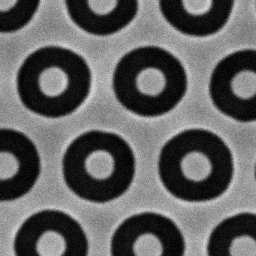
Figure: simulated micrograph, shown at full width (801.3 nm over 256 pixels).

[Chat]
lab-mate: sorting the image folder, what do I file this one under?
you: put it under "ring-shaped grooves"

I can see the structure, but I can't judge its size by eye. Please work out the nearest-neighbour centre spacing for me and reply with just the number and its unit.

95.8 pixels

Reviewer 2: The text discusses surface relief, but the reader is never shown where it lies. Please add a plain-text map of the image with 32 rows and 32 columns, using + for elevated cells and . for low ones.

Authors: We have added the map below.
++...+++...+++...+++...+++...+++
....++++....++...+++....+....+++
....+++++........++++........+++
...+++++++......++++++......++++
++++++++++++.++++++++++...++++++
++++++++++++++++++++++++++++++++
++++......++++++.....++++++++...
+++........++++........+++++....
++....+....+++.........++++.....
++...+++....++...+++...+++....++
++...+++...+++...++++..+++...+++
++...++....+++....++...+++...+++
+++........++++........+++......
+++.......++++++......+++++.....
+++++...+++++++++...++++++++....
++++++++++++++++++++++++++++++++
...++++++++...++++++++.....+++++
....+++++.......+++++.......++++
.....+++.........+++.........+++
++...+++...+++...+++...++....+++
++...+++...+++...+++...+++...+++
++...+++...+++...+++...+++...+++
.....+++.........+++....+....+++
....+++++.......++++.........+++
...+++++++.....+++++++......++++
++++++++++++++++++++++++++++++++
+++++...++++++++++.+++++++++++++
+++......+++++++......++++++....
++........+++++.......+++++.....
++...++....+++....+....+++......
++...+++...+++...+++...+++...+++
++...+++...+++...+++...+++...+++